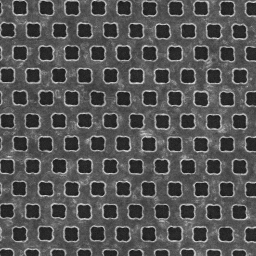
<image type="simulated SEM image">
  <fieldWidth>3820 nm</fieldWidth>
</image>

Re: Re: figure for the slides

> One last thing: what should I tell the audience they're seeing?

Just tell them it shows a regular array of holes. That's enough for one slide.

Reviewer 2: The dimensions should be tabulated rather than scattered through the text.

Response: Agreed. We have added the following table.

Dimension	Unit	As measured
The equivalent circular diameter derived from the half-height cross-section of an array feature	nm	225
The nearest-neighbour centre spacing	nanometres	380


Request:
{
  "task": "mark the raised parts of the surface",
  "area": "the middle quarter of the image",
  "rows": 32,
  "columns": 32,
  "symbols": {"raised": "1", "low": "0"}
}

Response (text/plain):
11111111111111111111111111111111
11110011110001111001111000111000
01100001110000110000111000111000
01100001110000110000111000111000
11110001110001111000111000111000
11111111111111111111111111111111
11111111111111111111111111111111
00001110001110001111000111000111
00001110001110000111000111000111
00001110001110000111000111000111
11111111111111111111111111111111
11111111111111111111111111111111
11110001111001111001111111111111
11100001110001110000111000111000
11100001110001110000111000111000
11110001110001111000111000111000
11111111111111111111111111111111
11111111111111111111111111111111
00011110001110001111001111000111
00001110001110001111000111000111
00001110001110000111000111000111
10011110001111001111000111000111
11111111111111111111111111111111
11111111111111111111111111111111
11100001110001110000111000111000
01110001110001110000111000111000
01110001110001110000111000111000
11111111111111111111111111111111
11111111111111111111111111111111
10011110011111001111001111100111
00001110001110000110000111000111
00001110001110000110000111000111